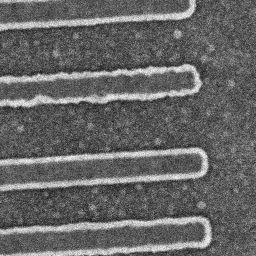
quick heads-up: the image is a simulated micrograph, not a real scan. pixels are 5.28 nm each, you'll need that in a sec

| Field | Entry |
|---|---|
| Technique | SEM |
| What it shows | one or a few lines or trenches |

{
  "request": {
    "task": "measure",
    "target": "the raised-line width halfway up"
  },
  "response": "136 nm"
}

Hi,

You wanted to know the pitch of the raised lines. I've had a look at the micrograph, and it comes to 408 nm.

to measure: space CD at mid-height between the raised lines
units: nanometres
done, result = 277